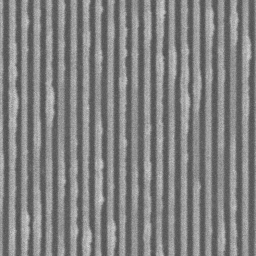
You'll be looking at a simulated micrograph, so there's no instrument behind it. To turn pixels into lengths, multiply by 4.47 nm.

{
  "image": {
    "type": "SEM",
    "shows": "parallel lines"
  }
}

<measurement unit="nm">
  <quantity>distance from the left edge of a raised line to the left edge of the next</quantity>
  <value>54.8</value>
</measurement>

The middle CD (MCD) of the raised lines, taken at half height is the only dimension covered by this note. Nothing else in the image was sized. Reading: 25.7 nm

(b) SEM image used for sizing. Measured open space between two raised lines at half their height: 0.0302 micrometres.